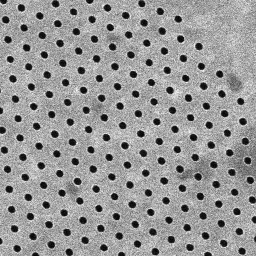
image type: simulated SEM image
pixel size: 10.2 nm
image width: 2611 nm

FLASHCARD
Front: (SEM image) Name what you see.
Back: a regular array of holes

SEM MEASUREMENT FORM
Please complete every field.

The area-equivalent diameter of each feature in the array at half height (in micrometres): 0.0719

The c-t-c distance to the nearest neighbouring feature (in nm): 199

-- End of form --